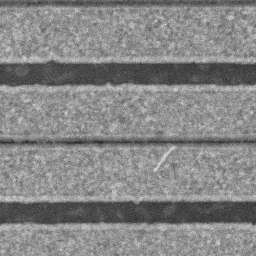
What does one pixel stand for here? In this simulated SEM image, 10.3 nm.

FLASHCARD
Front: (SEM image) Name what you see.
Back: one or a few lines or trenches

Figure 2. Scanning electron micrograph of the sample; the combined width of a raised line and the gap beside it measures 716 nanometres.